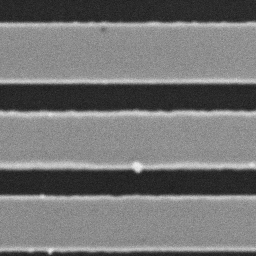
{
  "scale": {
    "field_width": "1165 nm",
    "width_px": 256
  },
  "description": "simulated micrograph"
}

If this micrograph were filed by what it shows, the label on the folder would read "lines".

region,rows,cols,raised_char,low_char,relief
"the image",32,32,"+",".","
................................
................................
................................
++++++++++++++++++++++++++++++++
++++++++++++++++++++++++++++++++
++++++++++++++++++++++++++++++++
++++++++++++++++++++++++++++++++
++++++++++++++++++++++++++++++++
++++++++++++++++++++++++++++++++
++++++++++++++++++++++++++++++++
................................
................................
................................
................................
++++++++++++++++++++++++++++++++
++++++++++++++++++++++++++++++++
++++++++++++++++++++++++++++++++
++++++++++++++++++++++++++++++++
++++++++++++++++++++++++++++++++
++++++++++++++++++++++++++++++++
++++++++++++++++++++++++++++++++
................................
................................
................................
.....+..........++..............
++++++++++++++++++++++++++++++++
++++++++++++++++++++++++++++++++
++++++++++++++++++++++++++++++++
++++++++++++++++++++++++++++++++
++++++++++++++++++++++++++++++++
++++++++++++++++++++++++++++++++
......+.........................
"